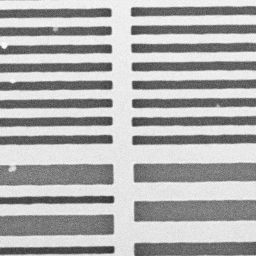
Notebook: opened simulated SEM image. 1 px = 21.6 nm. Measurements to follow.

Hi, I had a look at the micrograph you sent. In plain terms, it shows groups of lines, slits or small figures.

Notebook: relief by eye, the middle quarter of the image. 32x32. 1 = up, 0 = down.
00000000000011111000000000000000
00000000000011111000000000000000
11111111111111111111111111111111
11111111111111111111111111111111
00000000000011111000000000000000
00000000000011111000000000000000
00000001100011111111000111111111
11111111111111111111111111111111
11111101111111111111111111110000
00000000000011111000000000000000
00000000000011111000000000000000
11111111111111111111111111111111
11111111111111111111111111111111
00000000000011111000000000000000
00000000000011111000000000000000
00000000000011111000000000000000
11111111111111111111111111111111
11111111100111111111111111111111
00000000000011111000000000000000
00000000000011111000000000000000
11111111111111111011111111111111
11111111111111111111111111111111
11111111111111111111111111111111
11111111111111111111111111111111
11111111111111111111111111111111
00000000000011111000000000000000
00000000000011111000000000000000
00000000000001111000000000000000
00000000000001111000000000000000
00000000000001111000000000000000
11111111111111111111111111111111
11111111111111111111111111111111